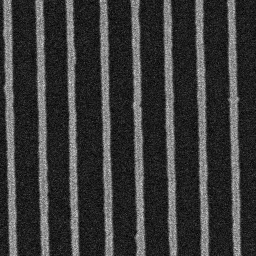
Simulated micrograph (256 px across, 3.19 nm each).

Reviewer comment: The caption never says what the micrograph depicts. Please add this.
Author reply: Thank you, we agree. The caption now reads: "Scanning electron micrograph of parallel lines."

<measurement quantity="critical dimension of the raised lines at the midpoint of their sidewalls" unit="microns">0.0227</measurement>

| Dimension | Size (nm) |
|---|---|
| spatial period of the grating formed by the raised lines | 102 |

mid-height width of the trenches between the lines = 0.0794 microns